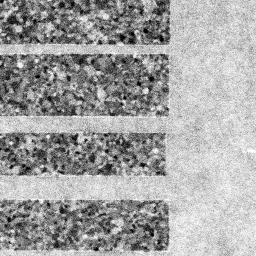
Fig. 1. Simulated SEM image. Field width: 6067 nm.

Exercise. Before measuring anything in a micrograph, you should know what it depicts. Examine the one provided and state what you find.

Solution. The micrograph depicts one or a few lines or trenches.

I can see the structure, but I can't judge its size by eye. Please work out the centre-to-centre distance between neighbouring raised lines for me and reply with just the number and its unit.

69.6 pixels